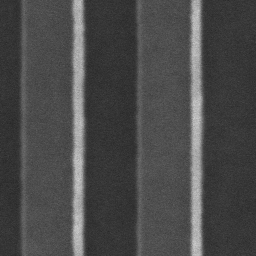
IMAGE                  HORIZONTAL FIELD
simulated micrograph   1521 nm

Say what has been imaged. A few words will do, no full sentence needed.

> lines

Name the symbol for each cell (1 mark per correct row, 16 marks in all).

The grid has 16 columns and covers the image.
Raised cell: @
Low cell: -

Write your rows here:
-@@@@----@@@----
-@@@@----@@@----
-@@@@----@@@----
-@@@@----@@@----
-@@@@----@@@@---
-@@@@----@@@@---
-@@@@----@@@@---
-@@@@----@@@@---
-@@@@----@@@@---
-@@@@----@@@@---
-@@@@----@@@@---
-@@@@----@@@@---
-@@@@----@@@@---
-@@@@----@@@@---
-@@@@----@@@@---
-@@@@----@@@@---